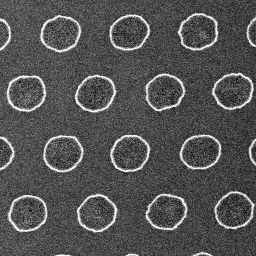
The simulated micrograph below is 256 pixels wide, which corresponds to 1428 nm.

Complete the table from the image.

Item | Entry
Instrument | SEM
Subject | a regular array of raised bodies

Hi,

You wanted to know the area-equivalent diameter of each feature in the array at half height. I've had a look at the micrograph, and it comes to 37.4 pixels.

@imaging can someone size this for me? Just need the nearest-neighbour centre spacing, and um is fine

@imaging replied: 0.382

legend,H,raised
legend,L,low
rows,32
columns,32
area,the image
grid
LLLLLLLLLLLLLLLLLLLLLLLLLLLLLLLL
LLLLLLLLLLLLLLLLLLLLLLLLLLLLLLLL
LLLLLLHHHLLLLLLHHHLLLLLHHHHLLLLL
HLLLLHHHHHLLLLHHHHHLLLLHHHHLLLLH
HLLLLHHHHHLLLLHHHHLLLLLHHHHLLLLH
HLLLLLHHHLLLLLHHHHLLLLLHHHHLLLLH
LLLLLLLLLLLLLLLLLLLLLLLLLLLLLLLL
LLLLLLLLLLLLLLLLLLLLLLLLLLLLLLLL
LLLLLLLLLLLLLLLLLLLLLLLLLLLLLLLL
LLLLLLLLLLLLHLLLLLLLHHLLLLLLHHHL
LHHHHLLLLLHHHHLLLLLHHHHLLLLHHHHH
LHHHHHLLLLHHHHLLLLHHHHHLLLLHHHHH
LHHHHLLLLLHHHHLLLLHHHHHLLLLHHHHL
LLHHHLLLLLHHHLLLLLLHHLLLLLLLHHLL
LLLLLLLLLLLLLLLLLLLLLLLLLLLLLLLL
LLLLLLLLLLLLLLLLLLLLLLLLLLLLLLLL
LLLLLLLLLLLLLLLLLLLLLLLLLLLLLLLL
HLLLLLHHHHLLLLLHHHLLLLLHHHHLLLLL
HHLLLLHHHHLLLLHHHHHLLLLHHHHHLLLH
HHLLLLHHHHLLLLHHHHHLLLLHHHHLLLLH
HLLLLLHHHHLLLLHHHHLLLLLHHHHLLLLL
LLLLLLLLLLLLLLLLLLLLLLLLLLLLLLLL
LLLLLLLLLLLLLLLLLLLLLLLLLLLLLLLL
LLLLLLLLLLLLLLLLLLLLLLLLLLLLLLLL
LLLHLLLLLLLHHLLLLLLLHHLLLLLLHHHL
LLHHHHLLLLHHHHLLLLLHHHHLLLLHHHHH
LHHHHHLLLLHHHHHLLLHHHHHLLLLHHHHH
LHHHHHLLLLHHHHLLLLLHHHHLLLLHHHHL
LLHHHLLLLLLHHLLLLLLLHHLLLLLLLHLL
LLLLLLLLLLLLLLLLLLLLLLLLLLLLLLLL
LLLLLLLLLLLLLLLLLLLLLLLLLLLLLLLL
LLLLLLLLLLLLLLLLLLLLLLLLLLLLLLLL